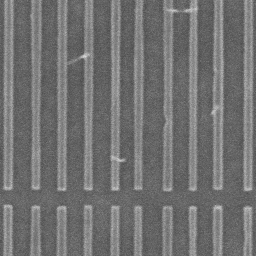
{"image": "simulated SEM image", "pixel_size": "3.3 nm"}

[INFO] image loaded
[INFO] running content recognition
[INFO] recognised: parallel lines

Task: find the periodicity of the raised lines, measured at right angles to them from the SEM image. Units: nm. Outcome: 88.1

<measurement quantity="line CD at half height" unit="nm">22.3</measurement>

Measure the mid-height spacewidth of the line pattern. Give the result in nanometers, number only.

63.6